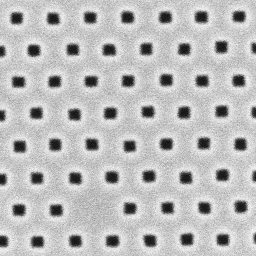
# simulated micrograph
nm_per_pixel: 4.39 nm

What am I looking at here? a regular array of holes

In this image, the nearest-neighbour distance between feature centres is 158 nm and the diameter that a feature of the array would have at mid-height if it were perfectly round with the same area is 0.0638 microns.